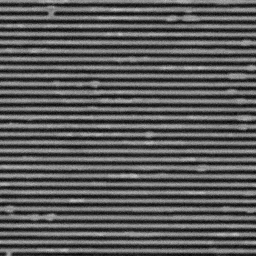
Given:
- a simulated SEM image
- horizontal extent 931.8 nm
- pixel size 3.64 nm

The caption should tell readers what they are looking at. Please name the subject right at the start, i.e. parallel lines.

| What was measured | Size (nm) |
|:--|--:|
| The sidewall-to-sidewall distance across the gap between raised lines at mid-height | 16.4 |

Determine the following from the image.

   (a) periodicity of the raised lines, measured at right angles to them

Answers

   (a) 0.0302 µm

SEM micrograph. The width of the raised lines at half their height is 13.2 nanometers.